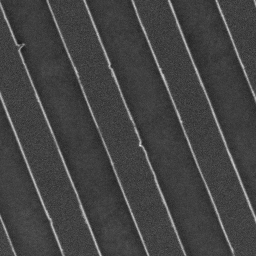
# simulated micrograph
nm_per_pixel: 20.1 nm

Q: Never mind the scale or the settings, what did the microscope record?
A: one or a few lines or trenches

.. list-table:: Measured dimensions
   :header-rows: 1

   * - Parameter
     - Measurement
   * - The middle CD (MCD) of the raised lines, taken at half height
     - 0.688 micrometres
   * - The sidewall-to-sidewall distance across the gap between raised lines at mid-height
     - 884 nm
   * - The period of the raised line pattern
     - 1.58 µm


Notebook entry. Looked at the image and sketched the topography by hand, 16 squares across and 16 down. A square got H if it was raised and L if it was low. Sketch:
LLLHHLLLHHHLLLHH
HLLLHHLLLHHLLLHH
HLLLHHLLLHHLLLLH
HLLLHHHLLLHHLLLH
HHLLLHHLLLHHLLLH
HHLLLHHLLLHHHLLL
HHHLLLHHLLLHHLLL
LHHLLLHHLLLHHLLL
LHHLLLHHHLLLHHLL
LHHHLLLHHLLLHHLL
LLHHLLLHHLLLHHHL
LLHHHLLLHHLLLHHL
LLLHHLLLHHLLLHHL
LLLHHLLLHHHLLLHH
LLLHHHLLLHHLLLHH
HLLLHHLLLHHLLLHH